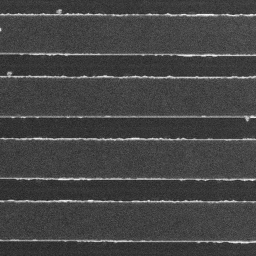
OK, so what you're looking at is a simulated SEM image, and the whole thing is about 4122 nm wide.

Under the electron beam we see lines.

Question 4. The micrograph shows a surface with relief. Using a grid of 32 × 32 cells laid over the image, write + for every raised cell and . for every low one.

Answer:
................................
................................
++++++++++++++++++++++++++++++++
++++++++++++++++++++++++++++++++
++++++++++++++++++++++++++++++++
++++++++++++++++++++++++++++++++
++++++++++++++++++++++++++++++++
................................
................................
...+............................
++++++++++++++++++++++++++++++++
++++++++++++++++++++++++++++++++
++++++++++++++++++++++++++++++++
++++++++++++++++++++++++++++++++
++++++++++++++++++++++++++++++++
................................
................................
++++++++++++++++++++++++++++++++
++++++++++++++++++++++++++++++++
++++++++++++++++++++++++++++++++
++++++++++++++++++++++++++++++++
++++++++++++++++++++++++++++++++
................................
................................
................................
++++++++++++++++++++++++++++++++
++++++++++++++++++++++++++++++++
++++++++++++++++++++++++++++++++
++++++++++++++++++++++++++++++++
++++++++++++++++++++++++++++++++
................................
................................